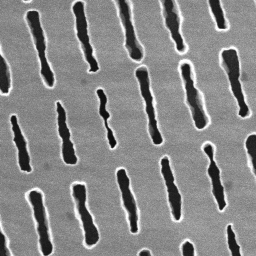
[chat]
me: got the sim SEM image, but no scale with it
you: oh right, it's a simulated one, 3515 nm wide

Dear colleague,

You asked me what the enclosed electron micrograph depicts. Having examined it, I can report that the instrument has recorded a regular array of holes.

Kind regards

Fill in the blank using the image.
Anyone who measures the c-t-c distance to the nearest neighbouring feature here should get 45.4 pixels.